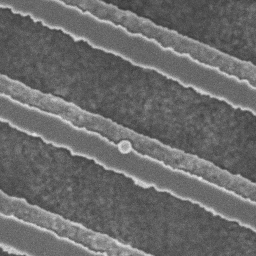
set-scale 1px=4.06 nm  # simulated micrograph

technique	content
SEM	lines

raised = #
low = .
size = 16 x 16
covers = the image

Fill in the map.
#######.........
...#######......
.....#######....
.......#######..
..........######
##..........####
####..........##
#######.........
..#######.......
....#######.....
.......#######..
.........#######
#...........####
####..........##
######..........
########........